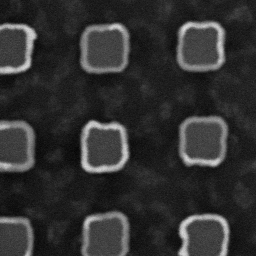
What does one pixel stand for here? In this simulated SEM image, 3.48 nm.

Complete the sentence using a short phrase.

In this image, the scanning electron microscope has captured raised bodies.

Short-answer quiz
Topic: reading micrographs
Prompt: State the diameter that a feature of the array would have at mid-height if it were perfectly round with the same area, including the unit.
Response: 49 px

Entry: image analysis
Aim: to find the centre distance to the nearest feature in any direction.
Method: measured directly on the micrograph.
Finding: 95.7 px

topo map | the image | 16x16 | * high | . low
................
............*...
**...***...***..
**...***...***..
*...............
................
................
............**..
**...***...***..
**...***...***..
*....**.........
................
................
......**....**..
**...***...***..
**...***...***..